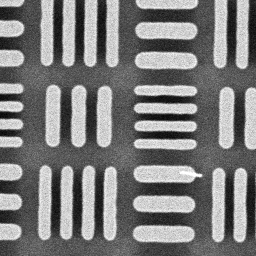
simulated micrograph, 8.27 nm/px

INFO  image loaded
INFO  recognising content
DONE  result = groups of lines, slits or small figures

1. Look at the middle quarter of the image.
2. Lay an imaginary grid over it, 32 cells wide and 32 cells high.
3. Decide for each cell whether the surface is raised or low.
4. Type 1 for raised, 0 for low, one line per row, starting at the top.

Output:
00000010000110000011111111111111
00000000000000000000000000000000
00000000000000000000000000000000
00000000000000000000000000000000
00000000000000000000000000000000
00000000000000000000000000000000
00111000011100000011111111111111
00111000011100000011111111111111
00111000011100000000000000000000
00111000011100000000000000000000
00111000011100000011111111111111
00111000111100000011111111111111
00111000011100000000000000000000
00111000011100000000000000000000
00111000011100000001111110000000
00111000011100000011111111111111
00111000111100000011111111111111
00111000111100000000000000000000
00111000011100000000000000000000
00111000011100000011111111111111
00010000010000000011111111111111
00000000000000000000000000000000
00000000000000000000000000000000
00000000000000000000000000000000
00000000000000000000000000000000
00000000000000000000000000000000
11000111001110000011111111111111
11000111001110000011111111111111
11000110001110000011111111111111
11000110001110000000000000000000
11000110001110000000000000000000
11000110001110000000000000000000